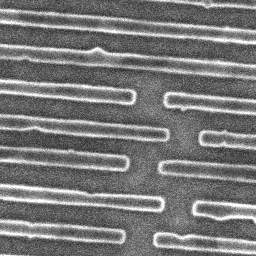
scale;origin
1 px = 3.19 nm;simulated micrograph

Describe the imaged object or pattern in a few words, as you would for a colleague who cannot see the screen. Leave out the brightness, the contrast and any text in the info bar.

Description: parallel lines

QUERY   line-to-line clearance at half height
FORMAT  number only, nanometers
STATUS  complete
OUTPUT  71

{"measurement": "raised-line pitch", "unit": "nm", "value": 112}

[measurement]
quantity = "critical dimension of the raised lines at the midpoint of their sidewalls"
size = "41.3 nanometres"